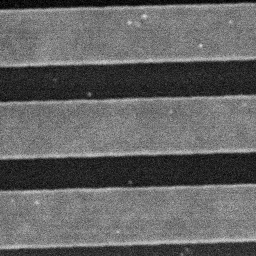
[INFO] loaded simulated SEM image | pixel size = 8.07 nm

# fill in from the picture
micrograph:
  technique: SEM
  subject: lines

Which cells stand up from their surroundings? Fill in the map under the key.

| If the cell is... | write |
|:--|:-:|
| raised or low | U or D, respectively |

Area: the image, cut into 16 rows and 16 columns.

DDDDUUUUUUUUUUUU
UUUUUUUUUUUUUUUU
UUUUUUUUUUUUUUUU
UUUUUUUUUUUUUUUU
DDDDDDDDDDDDDDDD
DDDDDDDDDDDDDDDD
UUUUUUUUUUUUUUUU
UUUUUUUUUUUUUUUU
UUUUUUUUUUUUUUUU
UUUUUUUUUUUUUUUU
DDDDDDDDDDDDDDDD
DDDDDDDDDDDDDDDD
UUUUUUUUUUUUUUUU
UUUUUUUUUUUUUUUU
UUUUUUUUUUUUUUUU
UUDDDDDDDDDDDDDD